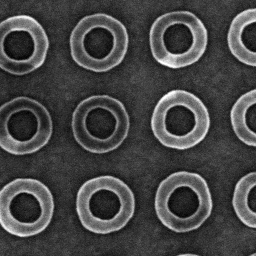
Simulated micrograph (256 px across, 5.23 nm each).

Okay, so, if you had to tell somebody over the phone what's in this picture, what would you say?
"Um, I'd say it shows ring-shaped raised bodies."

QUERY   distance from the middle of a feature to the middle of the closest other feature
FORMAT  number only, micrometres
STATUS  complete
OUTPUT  0.416